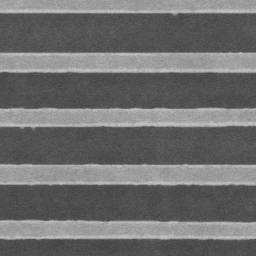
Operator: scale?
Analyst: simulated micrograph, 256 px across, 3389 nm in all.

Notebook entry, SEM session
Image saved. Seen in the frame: lines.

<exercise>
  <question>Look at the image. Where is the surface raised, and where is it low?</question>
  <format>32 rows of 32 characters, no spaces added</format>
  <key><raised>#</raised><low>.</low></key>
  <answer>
################################
################################
................................
................................
................................
................................
................................
################################
################################
................................
................................
................................
................................
................................
################################
################################
................................
................................
................................
................................
................................
################################
################################
................................
................................
................................
................................
................................
################################
################################
................................
................................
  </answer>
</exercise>